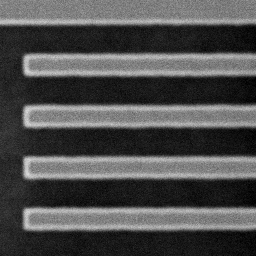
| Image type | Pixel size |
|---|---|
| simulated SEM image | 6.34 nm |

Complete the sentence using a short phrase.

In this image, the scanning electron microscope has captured groups of lines, slits or small figures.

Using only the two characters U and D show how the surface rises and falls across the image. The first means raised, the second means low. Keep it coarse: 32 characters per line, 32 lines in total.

UUUUUUUUUUUUUUUUUUUUUUUUUUUUUUUU
UUUUUUUUUUUUUUUUUUUUUUUUUUUUUUUU
UUUUUUUUUUUUUUUUUUUUUUUUUUUUUUUU
DDDDDDDDDDDDDDDDDDDDDDDDDDDDDDDD
DDDDDDDDDDDDDDDDDDDDDDDDDDDDDDDD
DDDDDDDDDDDDDDDDDDDDDDDDDDDDDDDD
DDDDDDDDDDDDDDDDDDDDDDDDDDDDDDDD
DDDUUUUUUUUUUUUUUUUUUUUUUUUUUUUU
DDDUUUUUUUUUUUUUUUUUUUUUUUUUUUUU
DDDDDDDDDDDDDDDDDDDDDDDDDDDDDDDD
DDDDDDDDDDDDDDDDDDDDDDDDDDDDDDDD
DDDDDDDDDDDDDDDDDDDDDDDDDDDDDDDD
DDDDDDDDDDDDDDDDDDDDDDDDDDDDDDDD
DDDDUUUUUUUUUUUUUUUUUUUUUUUUUUUU
DDDUUUUUUUUUUUUUUUUUUUUUUUUUUUUU
DDDDUUUUUUUUUUUUUUUUUUUUUUUUUUUU
DDDDDDDDDDDDDDDDDDDDDDDDDDDDDDDD
DDDDDDDDDDDDDDDDDDDDDDDDDDDDDDDD
DDDDDDDDDDDDDDDDDDDDDDDDDDDDDDDD
DDDDDDDDDDDDDDDDDDDDDDDDDDDDDDDD
DDDUUUUUUUUUUUUUUUUUUUUUUUUUUUUU
DDDUUUUUUUUUUUUUUUUUUUUUUUUUUUUU
DDDDDDDDDDDDDDDDDDDDDDDDDDDDDDDD
DDDDDDDDDDDDDDDDDDDDDDDDDDDDDDDD
DDDDDDDDDDDDDDDDDDDDDDDDDDDDDDDD
DDDDDDDDDDDDDDDDDDDDDDDDDDDDDDDD
DDDUUUUUUUUUUUUUUUUUUUUUUUUUUUUU
DDDUUUUUUUUUUUUUUUUUUUUUUUUUUUUU
DDDDUUUUUUUUUUDDUUUUUUDDDDDDDUUU
DDDDDDDDDDDDDDDDDDDDDDDDDDDDDDDD
DDDDDDDDDDDDDDDDDDDDDDDDDDDDDDDD
DDDDDDDDDDDDDDDDDDDDDDDDDDDDDDDD